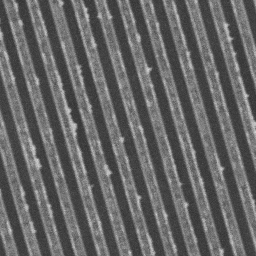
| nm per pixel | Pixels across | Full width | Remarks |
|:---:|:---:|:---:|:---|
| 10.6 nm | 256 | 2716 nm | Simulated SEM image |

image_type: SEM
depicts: parallel lines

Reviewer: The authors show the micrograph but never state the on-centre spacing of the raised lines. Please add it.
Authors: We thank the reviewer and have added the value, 0.232 micrometres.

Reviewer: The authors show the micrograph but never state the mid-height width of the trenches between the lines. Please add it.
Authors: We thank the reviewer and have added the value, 128 nanometres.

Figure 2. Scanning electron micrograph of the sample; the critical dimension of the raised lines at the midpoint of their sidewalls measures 110 nanometres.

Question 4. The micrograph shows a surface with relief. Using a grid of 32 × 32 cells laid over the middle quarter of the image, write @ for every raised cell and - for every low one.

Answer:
-@@@---@@---@@@---@@@---@@---@@@
-@@@---@@@---@@---@@@@--@@@---@@
--@@---@@@---@@----@@---@@@---@@
--@@@--@@@---@@@---@@----@@---@@
--@@@---@@----@@---@@@---@@----@
--@@@---@@@---@@---@@@---@@@---@
---@@---@@@---@@@---@@----@@---@
---@@----@@---@@@---@@@---@@---@
---@@@---@@----@@---@@@---@@----
@---@@---@@@---@@----@@---@@@---
@---@@@--@@@---@@@---@@----@@---
@@--@@@---@@---@@@---@@@---@@---
@@--@@@---@@----@@----@@---@@@--
@@---@@---@@@---@@----@@---@@@--
@@---@@----@@---@@@---@@@---@@--
@@@--@@@---@@----@@---@@@---@@--
@@@--@@@---@@@---@@@---@@---@@@-
@@@---@@---@@@---@@@---@@----@@-
@@@---@@----@@@--@@@---@@@---@@-
-@@---@@@---@@@---@@----@@---@@@
-@@----@@---@@@---@@----@@---@@@
-@@@---@@---@@@---@@@---@@@---@@
--@@---@@@---@@----@@---@@@---@@
--@@@--@@@---@@@---@@----@@---@@
--@@@---@@---@@@---@@@---@@----@
--@@@---@@@---@@---@@@---@@@---@
---@@---@@@---@@@---@@---@@@---@
---@@----@@@--@@@---@@----@@---@
---@@@---@@---@@@---@@@---@@@---
----@@---@@@---@@----@@---@@@---
----@@@--@@@---@@@---@@----@@---
@---@@@---@@---@@@---@@@---@@---